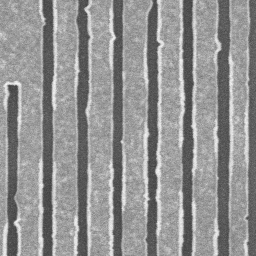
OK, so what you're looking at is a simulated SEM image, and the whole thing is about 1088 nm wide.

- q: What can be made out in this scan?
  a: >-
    parallel lines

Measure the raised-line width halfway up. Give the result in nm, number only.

103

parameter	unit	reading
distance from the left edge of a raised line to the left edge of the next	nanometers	148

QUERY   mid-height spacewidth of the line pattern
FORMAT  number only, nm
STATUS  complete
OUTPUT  44.1